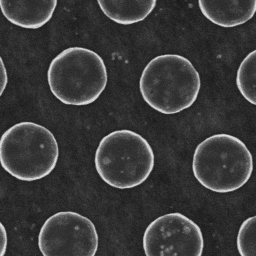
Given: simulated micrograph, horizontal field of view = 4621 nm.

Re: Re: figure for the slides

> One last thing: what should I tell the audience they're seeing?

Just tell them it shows raised bodies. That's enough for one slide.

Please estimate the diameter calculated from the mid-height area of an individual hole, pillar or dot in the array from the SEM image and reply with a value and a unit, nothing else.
1030 nm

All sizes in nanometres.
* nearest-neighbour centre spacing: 1640